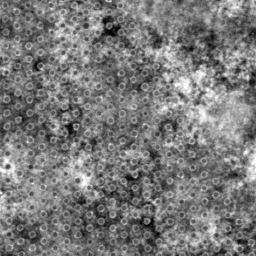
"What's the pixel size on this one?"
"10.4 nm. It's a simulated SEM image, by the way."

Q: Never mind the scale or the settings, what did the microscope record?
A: a regular array of raised bodies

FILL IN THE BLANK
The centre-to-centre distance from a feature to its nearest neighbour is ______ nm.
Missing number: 136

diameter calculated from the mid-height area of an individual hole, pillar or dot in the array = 6.08 px